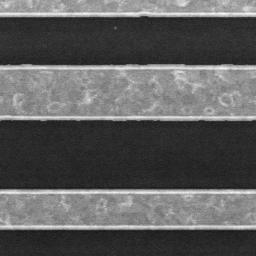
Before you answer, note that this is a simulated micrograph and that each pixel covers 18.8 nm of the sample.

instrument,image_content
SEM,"one or a few lines or trenches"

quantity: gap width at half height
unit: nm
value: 1220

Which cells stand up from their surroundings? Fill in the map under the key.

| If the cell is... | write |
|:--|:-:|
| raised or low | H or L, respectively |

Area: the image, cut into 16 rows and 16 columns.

HHHHHHHHHHHHHHHH
LLLLLLLLLLLLLLLL
LLLLLLLLLLLLLLLL
LLLLLLLLLLLLLLLL
HHHHHHHHHHHHHHHH
HHHHHHHHHHHHHHHH
HHHHHHHHHHHHHHHH
LLLLLLLLLLLLLLLL
LLLLLLLLLLLLLLLL
LLLLLLLLLLLLLLLL
LLLLLLLLLLLLLLLL
LLLLLLLLLLLLLLLL
HHHHHHHHHHHHHHHH
HHHHHHHHHHHHHHHH
LLLLLLLLLLLLLLLL
LLLLLLLLLLLLLLLL